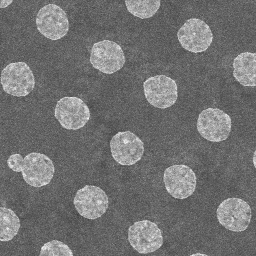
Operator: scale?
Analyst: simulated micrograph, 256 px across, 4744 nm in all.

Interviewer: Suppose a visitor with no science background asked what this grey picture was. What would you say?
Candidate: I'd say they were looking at a regular array of raised bodies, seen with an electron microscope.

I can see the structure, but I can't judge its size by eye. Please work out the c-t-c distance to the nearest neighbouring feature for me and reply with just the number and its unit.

1180 nm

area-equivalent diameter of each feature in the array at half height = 612 nm